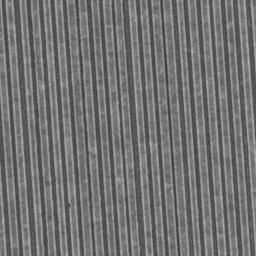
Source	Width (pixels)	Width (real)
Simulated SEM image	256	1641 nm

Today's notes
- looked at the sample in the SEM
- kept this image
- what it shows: parallel lines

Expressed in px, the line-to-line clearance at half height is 6.1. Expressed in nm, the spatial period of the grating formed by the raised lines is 78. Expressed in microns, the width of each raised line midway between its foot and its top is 0.0391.